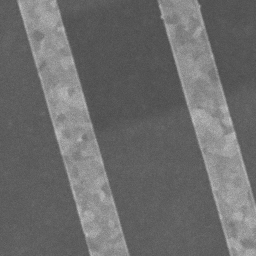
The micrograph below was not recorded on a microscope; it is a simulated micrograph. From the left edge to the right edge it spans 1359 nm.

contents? one or a few lines or trenches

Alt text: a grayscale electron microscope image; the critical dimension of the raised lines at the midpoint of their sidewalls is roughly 195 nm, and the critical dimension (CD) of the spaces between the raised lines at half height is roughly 521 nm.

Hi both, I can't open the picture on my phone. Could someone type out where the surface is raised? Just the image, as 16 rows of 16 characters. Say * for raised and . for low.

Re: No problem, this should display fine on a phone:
.***......**....
..**......***...
..**.......**...
..**.......**...
..***......***..
...**......***..
...**.......**..
...***......**..
....**......***.
....**.......**.
....***......**.
....***......***
.....**......***
.....**.......**
.....***......**
......**......**